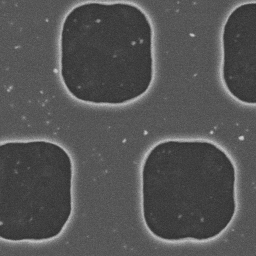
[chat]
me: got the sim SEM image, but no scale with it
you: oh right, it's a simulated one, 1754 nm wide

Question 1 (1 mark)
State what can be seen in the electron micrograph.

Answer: holes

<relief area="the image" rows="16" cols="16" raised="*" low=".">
*****....******.
****.....*****..
****.....*****..
****.....*****..
****.....*****..
****.....*****..
****************
****************
****************
....*****.....**
....*****......*
....*****......*
....*****......*
....*****......*
....******....**
****************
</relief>